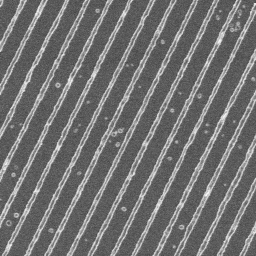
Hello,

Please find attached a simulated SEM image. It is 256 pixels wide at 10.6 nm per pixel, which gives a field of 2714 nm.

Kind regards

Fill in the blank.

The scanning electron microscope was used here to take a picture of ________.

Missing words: parallel lines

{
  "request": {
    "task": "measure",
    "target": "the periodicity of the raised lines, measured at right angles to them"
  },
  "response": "205 nanometres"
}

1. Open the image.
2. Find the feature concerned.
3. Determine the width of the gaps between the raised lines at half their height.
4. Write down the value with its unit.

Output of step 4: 0.162 µm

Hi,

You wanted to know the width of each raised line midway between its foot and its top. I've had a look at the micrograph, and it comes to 41.6 nanometers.